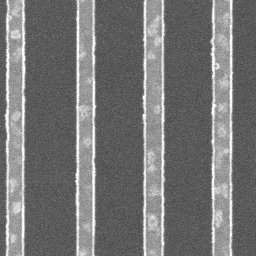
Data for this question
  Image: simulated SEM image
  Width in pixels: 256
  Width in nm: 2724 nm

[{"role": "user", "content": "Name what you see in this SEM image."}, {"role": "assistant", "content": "one or a few lines or trenches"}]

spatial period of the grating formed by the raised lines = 731 nanometers